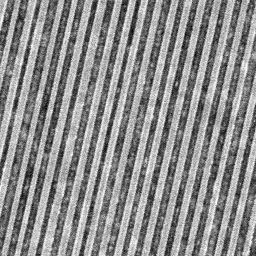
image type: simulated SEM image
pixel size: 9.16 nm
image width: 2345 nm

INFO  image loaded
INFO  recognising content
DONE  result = parallel lines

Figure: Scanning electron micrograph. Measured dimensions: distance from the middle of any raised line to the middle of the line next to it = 127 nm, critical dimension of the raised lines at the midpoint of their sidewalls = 5.85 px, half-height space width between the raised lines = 72.6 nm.